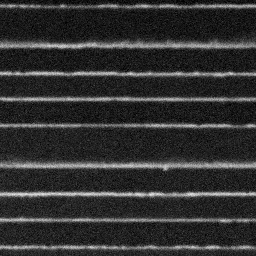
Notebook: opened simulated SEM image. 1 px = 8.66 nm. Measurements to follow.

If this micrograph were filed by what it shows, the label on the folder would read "lines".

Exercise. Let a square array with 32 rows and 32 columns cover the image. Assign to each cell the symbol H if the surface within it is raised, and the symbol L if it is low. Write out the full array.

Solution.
LLLLLLLLLLLLLLLLLLLLLLLLLLLLLLLL
HHHHHHHHHHHHHHHHHHHHHHHHHHHHHHHH
HHHHHHHHHHHHHHHHHHHHHHHHHHHHHHHH
HHHHHHHHHHHHHHHHHHHHHHHHHHHHHHHH
HHHHHHHHHHHHHHHHHHHHHHHHHHHHHHHH
HHHHHHHHHHHHHHHHHHHHHHHHHHHHHHHH
LLLLLLLLLLLLLLLLLLLLLLLLLLLLLLLL
LLLLLLLLLLLLLLLLLLLLLLLLLLLLLLLL
LLLLLLLLLLLLLLLLLLLLLLLLLLLLLLLL
HHHHHHHHHHHHHHHHHHHHHHHHHHHHHHHH
HHHHHHHHHHHHHHHHHHHHHHHHHHHHHHHH
HHHHHHHHHHHHHHHHHHHHHHHHHHHHHHHH
LLLLLLLLLLLLLLLLLLLLLLLLLLLLLLLL
LLLLLLLLLLLLLLLLLLLLLLLLLLLLLLLL
LLLLLLLLLLLLLLLLLLLLLLLLLLLLLLLL
LLLLLLLLLLLLLLLLLLLLLLLLLLLLLLLL
HHHHHHHHHHHHHHHHHHHHHHHHHHHHHHHH
HHHHHHHHHHHHHHHHHHHHHHHHHHHHHHHH
HHHHHHHHHHHHHHHHHHHHHHHHHHHHHHHH
HHHHHHHHHHHHHHHHHHHHHHHHHHHHHHHH
LLHHHHHHHHHHHHHHHHHHHHHHHHHHHHHH
LLLLLLLLLLLLLLLLLLLLLLLLLLLLLLLL
LLLLLLLLLLLLLLLLLLLLLLLLLLLLLLLL
LLLLLLLLLLLLLLLLLLLLLLLLLLLLLLLL
HHHHHHHHHHHHHHHHHHHHHHHHHHHHHHHH
HHHHHHHHHHHHHHHHHHHHHHHHHHHHHHHH
HHHHHHHHHHHHHHHHHHHHHHHHHHHHHHHH
HHHHHHHHHHHHHHHHHHHHHHHHHHHHHHHH
LLLLLLLLLLLLLLLLLLLLLLLLLLLLLLLL
LLLLLLLLLLLLLLLLLLLLLLLLLLLLLLLL
LLLLLLLLLLLLLLLLLLLLLLLLLLLLLLLL
HHHHHHHHHHHHHHHHHHHHHHHHHHHHHHHH